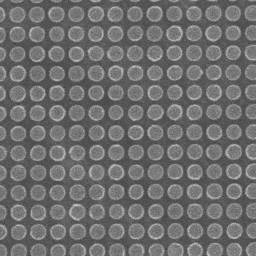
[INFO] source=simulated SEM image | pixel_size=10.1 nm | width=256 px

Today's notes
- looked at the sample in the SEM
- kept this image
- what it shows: a regular array of raised bodies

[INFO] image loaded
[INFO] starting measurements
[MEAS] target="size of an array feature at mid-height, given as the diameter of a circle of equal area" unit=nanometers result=154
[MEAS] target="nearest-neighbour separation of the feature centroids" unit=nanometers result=196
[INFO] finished